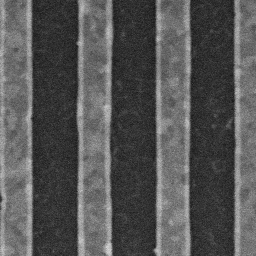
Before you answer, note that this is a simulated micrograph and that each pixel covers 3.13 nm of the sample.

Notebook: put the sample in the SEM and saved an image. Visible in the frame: one or a few lines or trenches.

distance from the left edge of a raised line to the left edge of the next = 0.246 µm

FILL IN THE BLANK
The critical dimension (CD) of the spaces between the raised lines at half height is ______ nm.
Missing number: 155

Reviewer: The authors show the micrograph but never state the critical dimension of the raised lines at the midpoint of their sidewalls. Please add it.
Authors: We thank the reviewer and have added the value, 0.0907 um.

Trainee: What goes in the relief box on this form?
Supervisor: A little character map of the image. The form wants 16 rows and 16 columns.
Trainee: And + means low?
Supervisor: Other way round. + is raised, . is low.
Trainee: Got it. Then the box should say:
++...++...++...+
++...++...++...+
++...++...++...+
++...++...++...+
++...++...++...+
++...++...++...+
++...++...++...+
++...++...++...+
++...++...++...+
++...++...++...+
++...++...++...+
++...++...++...+
++...++...++...+
++...++...++...+
++...++...++...+
++...++...++...+